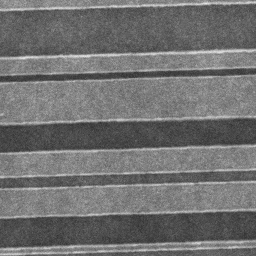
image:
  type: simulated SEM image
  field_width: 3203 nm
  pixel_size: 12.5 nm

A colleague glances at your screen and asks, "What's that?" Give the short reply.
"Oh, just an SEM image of lines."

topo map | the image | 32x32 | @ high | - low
@@@@@@@@@@@@@@@@@@@@@@@---------
--------------------------------
--------------------------------
--------------------------------
--------------------------------
--------------------------------
------------------------------@@
@@@@@@@@@@@@@@@@@@@@@@@@@@@@@@@@
@@@@@@@@@@@@@@@@@@@@@@@@@@@@@@@@
@@@@@@@@@@@@@@@@@@@@@@@@@@@@@@@@
@@@@@@@@@@@@@@@@@@@@@@@@@@@@@@@@
@@@@@@@@@@@@@@@@@@@@@@@@@@@@@@@@
@@@@@@@@@@@@@@@@@@@@@@@@@@@@@@@@
@@@@@@@@@@@@@@@@@@@@@@@@@@@@@@@@
@@@@@@@@@@@@@@@@@@@@@@@@@@@@@@@@
--------------------------------
--------------------------------
--------------------------------
-----------------------@@@@@@@@@
@@@@@@@@@@@@@@@@@@@@@@@@@@@@@@@@
@@@@@@@@@@@@@@@@@@@@@@@@@@@@@@@@
@@@@@@@@@@@@@@@@@@@@@@@@@@@@@@@@
@@@@@@@@@@@@@@@@@@@@@@@@@@@@@@@@
@@@@@@@@@@@@@@@@@@@@@@@@@@@@@@@@
@@@@@@@@@@@@@@@@@@@@@@@@@@@@@@@@
@@@@@@@@@@@@@@@@@@@@@@@@@@@@@@@@
@@@@@@@@@@@@@@@@@@@@@@----------
--------------------------------
--------------------------------
--------------------------------
--------------------@@@@@@@@@@@@
@@@@@@@@@@@@@@@@@@@@@@@@@@@@@@@@